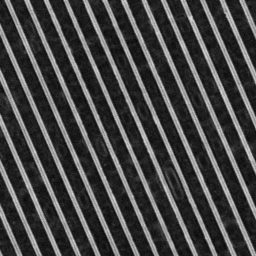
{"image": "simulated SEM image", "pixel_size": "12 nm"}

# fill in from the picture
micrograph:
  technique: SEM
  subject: parallel lines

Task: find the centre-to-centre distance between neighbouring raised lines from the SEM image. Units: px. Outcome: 17.9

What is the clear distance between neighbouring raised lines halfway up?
14.9 px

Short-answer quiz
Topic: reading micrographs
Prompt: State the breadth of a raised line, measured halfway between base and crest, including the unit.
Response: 2.98 px